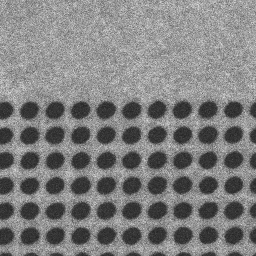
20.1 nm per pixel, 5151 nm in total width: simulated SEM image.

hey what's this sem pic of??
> a regular array of holes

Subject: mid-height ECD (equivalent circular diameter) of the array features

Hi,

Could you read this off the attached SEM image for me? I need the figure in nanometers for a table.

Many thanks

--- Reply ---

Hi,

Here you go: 372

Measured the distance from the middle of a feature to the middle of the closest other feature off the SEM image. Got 0.504 µm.